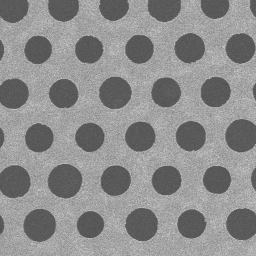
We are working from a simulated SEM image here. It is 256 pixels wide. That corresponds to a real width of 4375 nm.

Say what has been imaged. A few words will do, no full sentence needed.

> a regular array of holes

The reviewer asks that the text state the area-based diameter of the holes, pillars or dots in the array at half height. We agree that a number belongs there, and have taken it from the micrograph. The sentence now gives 29.8 px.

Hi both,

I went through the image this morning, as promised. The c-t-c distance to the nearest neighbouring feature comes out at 0.86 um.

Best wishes